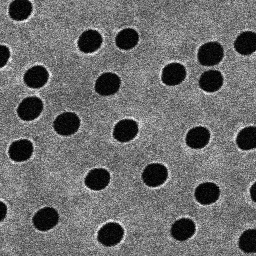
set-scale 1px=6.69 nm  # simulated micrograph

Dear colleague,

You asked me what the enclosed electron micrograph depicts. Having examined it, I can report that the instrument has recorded a regular array of holes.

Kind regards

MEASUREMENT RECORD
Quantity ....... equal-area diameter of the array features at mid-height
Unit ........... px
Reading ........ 25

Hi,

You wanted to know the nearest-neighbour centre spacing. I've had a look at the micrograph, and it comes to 289 nm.